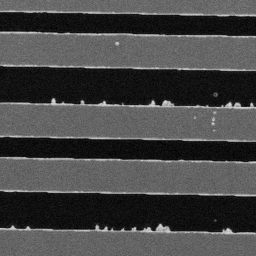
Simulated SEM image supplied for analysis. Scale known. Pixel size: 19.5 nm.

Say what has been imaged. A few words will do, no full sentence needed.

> lines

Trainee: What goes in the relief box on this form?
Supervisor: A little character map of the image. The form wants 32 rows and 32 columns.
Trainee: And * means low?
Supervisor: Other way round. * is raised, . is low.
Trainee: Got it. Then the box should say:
********************************
...**.**************************
................................
................................
*****************************...
********************************
********************************
********************************
................****************
................................
................................
................................
................................
********************************
********************************
********************************
********************************
.......................*********
................................
................................
********************************
********************************
********************************
********************************
................................
................................
................................
................................
................................
********************************
********************************
********************************